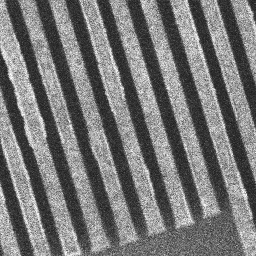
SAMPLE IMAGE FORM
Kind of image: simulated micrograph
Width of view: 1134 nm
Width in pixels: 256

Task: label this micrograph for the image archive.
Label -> parallel lines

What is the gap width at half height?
55.1 nanometers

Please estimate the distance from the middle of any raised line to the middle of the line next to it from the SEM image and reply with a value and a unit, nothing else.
128 nm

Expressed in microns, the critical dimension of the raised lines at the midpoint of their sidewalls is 0.0763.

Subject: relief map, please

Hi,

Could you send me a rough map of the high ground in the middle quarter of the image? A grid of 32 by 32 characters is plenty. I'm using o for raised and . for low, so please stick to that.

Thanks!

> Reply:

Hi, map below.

.oooo...ooooo...oooo....oooo...o
.ooooo...ooooo...oooo...oooo....
..oooo...ooooo...oooo...ooooo...
..oooo...ooooo...oooo....oooo...
..ooooo...oooo...ooooo...oooo...
..ooooo...oooo....oooo...oooo...
...oooo...ooooo...oooo....oooo..
...oooo...ooooo...ooooo...oooo..
...ooooo...oooo....oooo...oooo..
....oooo...ooooo...oooo...ooooo.
o...oooo....oooo...oooo....oooo.
o...ooooo...oooo....oooo...oooo.
o....oooo...ooooo...oooo...ooooo
oo...oooo...ooooo...oooo....oooo
oo...oooo....oooo...ooooo...oooo
oo...ooooo...oooo....oooo...oooo
ooo...oooo...ooooo...oooo....ooo
ooo...oooo....oooo...ooooo...ooo
ooo...ooooo...oooo....oooo...ooo
ooo...ooooo...ooooo...oooo...ooo
oooo...oooo....oooo...ooooo...oo
oooo...ooooo...oooo....oooo...oo
oooo...ooooo...ooooo...oooo...oo
ooooo...oooo...ooooo...oooo....o
.oooo...oooo....oooo...ooooo...o
.oooo....oooo...ooooo...oooo...o
.ooooo...oooo...ooooo...oooo....
..oooo...oooo....oooo...ooooo...
..oooo...ooooo...oooo....oooo...
..oooo....oooo...ooooo...oooo...
...oooo...oooo....oooo...ooooo..
...oooo...ooooo...oooo....oooo..